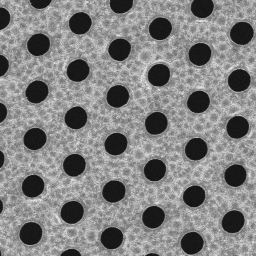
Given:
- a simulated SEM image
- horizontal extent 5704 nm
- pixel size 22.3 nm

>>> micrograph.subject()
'a regular array of holes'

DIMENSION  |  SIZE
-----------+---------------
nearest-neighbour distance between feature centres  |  1030 nm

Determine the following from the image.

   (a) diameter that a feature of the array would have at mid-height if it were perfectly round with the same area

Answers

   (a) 509 nm